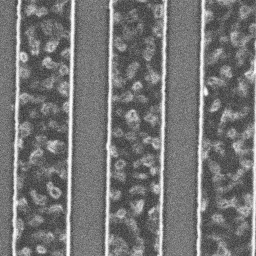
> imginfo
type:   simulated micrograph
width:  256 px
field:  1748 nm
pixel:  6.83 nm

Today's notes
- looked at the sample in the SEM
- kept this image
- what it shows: one or a few lines or trenches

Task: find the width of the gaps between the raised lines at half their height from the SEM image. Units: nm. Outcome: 253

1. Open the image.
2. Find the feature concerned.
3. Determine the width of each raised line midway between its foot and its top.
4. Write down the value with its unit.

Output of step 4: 378 nanometres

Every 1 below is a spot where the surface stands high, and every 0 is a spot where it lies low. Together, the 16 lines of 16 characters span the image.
0111100111000111
0111100111000111
0111100111000111
0111100111000111
0111100111000111
0111000111000111
0111000111000111
0111000111000111
0111000111000111
0111000111001111
0111000111001111
0111000111001111
0111000111001111
0111000111001111
0111000111001111
0111000111001111